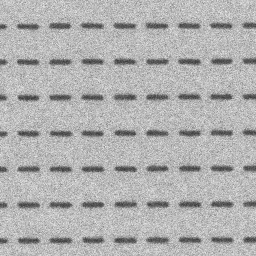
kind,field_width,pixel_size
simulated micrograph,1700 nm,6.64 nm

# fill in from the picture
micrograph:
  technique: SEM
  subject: a regular array of holes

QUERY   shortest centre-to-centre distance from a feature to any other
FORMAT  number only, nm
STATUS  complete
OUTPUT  212